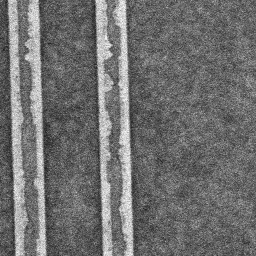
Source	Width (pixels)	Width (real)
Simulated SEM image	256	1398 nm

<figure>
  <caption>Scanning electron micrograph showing one or a few lines or trenches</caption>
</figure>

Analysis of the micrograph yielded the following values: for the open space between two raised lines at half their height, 337 nanometers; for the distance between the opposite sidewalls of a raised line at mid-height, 141 nm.